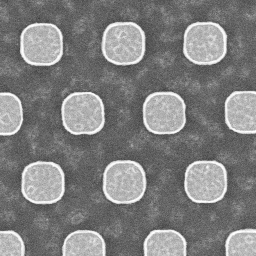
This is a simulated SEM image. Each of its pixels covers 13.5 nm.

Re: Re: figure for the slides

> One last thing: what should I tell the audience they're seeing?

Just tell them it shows a regular array of raised bodies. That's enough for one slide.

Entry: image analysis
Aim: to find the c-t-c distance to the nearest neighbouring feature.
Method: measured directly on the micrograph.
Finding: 1080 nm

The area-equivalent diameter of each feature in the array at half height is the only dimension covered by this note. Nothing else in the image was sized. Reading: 582 nm